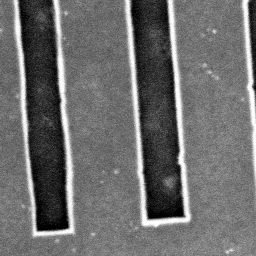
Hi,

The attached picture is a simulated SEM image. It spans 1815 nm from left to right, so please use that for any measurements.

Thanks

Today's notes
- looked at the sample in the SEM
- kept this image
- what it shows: one or a few lines or trenches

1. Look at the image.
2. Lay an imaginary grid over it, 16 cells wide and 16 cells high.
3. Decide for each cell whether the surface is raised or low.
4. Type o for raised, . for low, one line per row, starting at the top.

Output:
o...oooo...oooo.
o...oooo...oooo.
o...oooo...oooo.
o...oooo...ooooo
o...oooo...ooooo
o...oooo...ooooo
o...oooo...ooooo
oo..ooooo..ooooo
oo..ooooo..ooooo
oo..ooooo..ooooo
oo..ooooo..ooooo
oo..ooooo...oooo
oo..ooooo...oooo
oo..ooooo...oooo
oooooooooooooooo
oooooooooooooooo